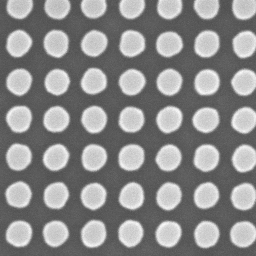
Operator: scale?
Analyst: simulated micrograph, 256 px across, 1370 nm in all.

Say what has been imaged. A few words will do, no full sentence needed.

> a regular array of raised bodies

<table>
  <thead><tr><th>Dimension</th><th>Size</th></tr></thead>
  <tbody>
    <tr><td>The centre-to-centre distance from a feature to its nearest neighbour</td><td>0.199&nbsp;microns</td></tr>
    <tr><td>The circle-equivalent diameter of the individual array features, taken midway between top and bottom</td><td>133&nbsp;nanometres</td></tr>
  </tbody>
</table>